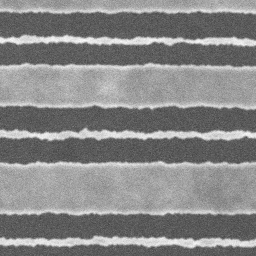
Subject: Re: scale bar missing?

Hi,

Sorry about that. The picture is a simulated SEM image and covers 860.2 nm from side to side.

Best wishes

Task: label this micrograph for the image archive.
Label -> lines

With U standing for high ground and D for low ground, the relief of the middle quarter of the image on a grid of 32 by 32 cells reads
UUUUUUUUUUUUUUDUUUUUUUUUUUUUUUUU
UUUUUUUUUUUUUUUUUUUUUUUUUUUUUUUU
UUUUUUUUUUUUUUUUUUUUUUUUUUUUUUUU
UUUUUUUUUUUUUUUUUUUUUUUUUUUUUUUU
UUUUUUUUUUUUUUUUUUUUUUUUUUUUUUUU
UUUUUUUUUUUUUUUUUUUUUUUUUUUUUUUU
UUUUUUUUUUUUUUUUUUUUUUUUUUUUUUUU
UUUUUUUUUUUUUUUUUUUUUUUUUUUUUUUU
UUUUUUUUUUUUUUUUUUUUUUUUUUUUUUUU
UUUUUUUUUUUUUUUUUUUUUUUUUUUUUUUU
UUUUUUUDUUUUUUUUUUUUUUUUUUUDUUUU
DDDDDDDDDDDDDDDDDDDDDDDDDDDDDDDD
DDDDDDDDDDDDDDDDDDDDDDDDDDDDDDDD
DDDDDDDDDDDDDDDDDDDDDDDDDDDDDDDD
DDDDDDDDDDDDDDDDDDDDDDDDDDDDDDDD
DDDDDDDDDDDDDDDDDDDDDDDDDDDDDDDD
DDDDDUDDDDDDDDDDDDDDDDDDDDDDDDDD
UUUUUUUUUUUUUUUUUUUUDUUUUUUUUUUU
UDDDUDDUUUUDUUUUUDUUUDUUUDUDDUUD
DDDDDDDDDDDDDDDDDDDDDDDDDDDDDDDD
DDDDDDDDDDDDDDDDDDDDDDDDDDDDDDDD
DDDDDDDDDDDDDDDDDDDDDDDDDDDDDDDD
DDDDDDDDDDDDDDDDDDDDDDDDDDDDDDDD
DDDDDDDDDDDDDDDDDDDDDDDDDDDDDDDD
DDDDDDDDDDDDDDDDDDDDDDDUUDDDDDDD
UUUUUUUUUUUUUUUUUUUUUUUUUUUUUUUU
UUUUUUUUUUUUUUUUUUUUUUUUUUUUUUUU
UUUUUUUUUUUUUUUUUUUUUUUUUUUUUUUU
UUUUUUUUUUUUUUUUUUUUUUUUUUUUUUUU
UUUUUUUUUUUUUUUUUUUUUUUUUUUUUUUU
UUUUUUUUUUUUUUUUUUUUUUUUUUUUUUUU
UUUUUUUUUUUUUUUUUUUUUUUUUUUUUUUU